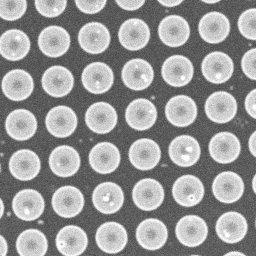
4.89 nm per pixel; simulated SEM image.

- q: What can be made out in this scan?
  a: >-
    an array of small figures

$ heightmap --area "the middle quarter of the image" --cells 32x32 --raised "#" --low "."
......#####....#######...#######
#....#######...#######...#######
##...#######...#######...#######
##...#######...#######...#######
##...#######...#######....#####.
##...#######....#####......##...
##....#####.....................
#...............................
...........................####.
.................#####....######
.......#####....#######...######
##....#######...#######..#######
###..########..########...######
###..########..########...######
###...#######...#######....#####
###...#######....#####.......#..
##.....#####....................
##..............................
............................####
..................#####....#####
........#####....######...######
###....#######..########..######
###....#######..########..######
####..########..########...#####
####..########...#######....####
####...######.....#####......#..
###.....####....................
##..............................
.............................###
...................####.....####
.........####.....######...#####
###.....######...########..#####